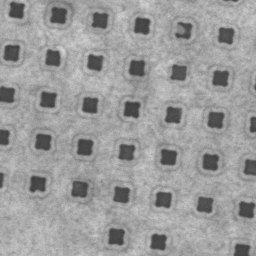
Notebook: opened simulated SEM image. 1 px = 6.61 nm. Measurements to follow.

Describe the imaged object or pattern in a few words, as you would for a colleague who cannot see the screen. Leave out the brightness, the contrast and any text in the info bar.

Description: a regular array of holes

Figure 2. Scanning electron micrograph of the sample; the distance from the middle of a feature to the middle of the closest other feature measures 0.277 micrometres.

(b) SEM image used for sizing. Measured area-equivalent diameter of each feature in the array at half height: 119 nm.